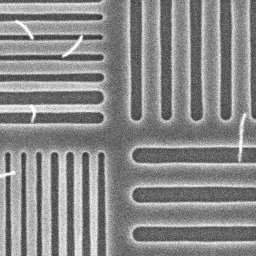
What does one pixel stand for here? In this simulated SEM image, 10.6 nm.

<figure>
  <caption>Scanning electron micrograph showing groups of lines, slits or small figures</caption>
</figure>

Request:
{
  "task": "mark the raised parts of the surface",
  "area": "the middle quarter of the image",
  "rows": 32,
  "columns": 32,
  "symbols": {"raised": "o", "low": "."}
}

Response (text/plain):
oooooooooooooooo....oooo...oooo.
oooooooooooooooo....oooo...oooo.
..........oooooo....oooo...oooo.
..........oooooo....oooo...oooo.
.........ooooooo....oooo...oooo.
oooooooooooooooo....oooo...oooo.
ooooooo.oooooooo....oooo...oooo.
..........oooooo....oooo...oooo.
..........oooooo....oooo...oooo.
..........oooooo....oooo...oooo.
oooooooooooooooo....oooo...oooo.
oooooooooooooooo....oooo...oooo.
..........oooooo....oooo...oooo.
..........ooooooo..ooooo...ooooo
..........oooooooooooooooooooooo
oooooooooooooooooooooooooooooooo
oooooooooooooooooooooooooooooooo
oooooooooooooooooooooooooooooooo
oooooooooooooooooooooooooooooooo
oooooooooooooooooooooooooooooooo
oooooooooooooooooooooooooooooooo
oooooooooooooooooo..............
...oo.oo..ooooooo...............
...o...o..ooooooo...............
...o...o..oooooooo..............
...o...o..oooooooooooooooooooooo
...o...o..oooooooooooooooooooooo
...o...o...ooooooooooooooooooooo
...o...o...ooooooooooooooooooooo
...o...o...ooooooooooooooooooooo
...o...o...ooooooooooo..........
...o...o...oooooo...............